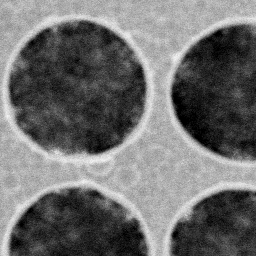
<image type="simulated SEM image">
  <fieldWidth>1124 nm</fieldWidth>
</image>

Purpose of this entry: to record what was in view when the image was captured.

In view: holes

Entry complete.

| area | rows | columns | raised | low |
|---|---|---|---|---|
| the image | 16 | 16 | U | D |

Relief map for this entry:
UUUUUUUUUUUUUUUU
UUUDDDUUUUUUUUDD
UUDDDDDDUUUUDDDD
UDDDDDDDDUUDDDDD
UDDDDDDDDUUDDDDD
DDDDDDDDDUUDDDDD
UDDDDDDDDUUDDDDD
UDDDDDDDDUUDDDDD
UUDDDDDDUUUUDDDD
UUUDDDDUUUUUUDDD
UUUUUUUUUUUUUUUU
UUUUUUUUUUUUUUUU
UUDDDDDUUUUUDDDD
UDDDDDDDDUUDDDDD
UDDDDDDDDUUDDDDD
DDDDDDDDDUDDDDDD